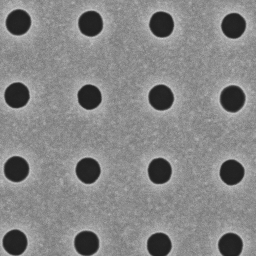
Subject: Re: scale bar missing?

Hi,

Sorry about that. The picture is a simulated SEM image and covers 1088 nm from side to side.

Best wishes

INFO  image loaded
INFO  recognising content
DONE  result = a regular array of holes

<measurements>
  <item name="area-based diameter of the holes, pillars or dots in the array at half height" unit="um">0.106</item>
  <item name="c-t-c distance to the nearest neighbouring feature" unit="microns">0.304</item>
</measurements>